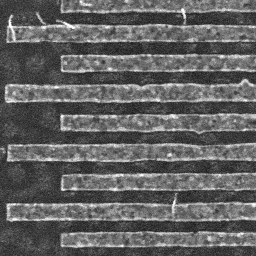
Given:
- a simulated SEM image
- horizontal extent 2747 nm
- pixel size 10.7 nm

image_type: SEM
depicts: parallel lines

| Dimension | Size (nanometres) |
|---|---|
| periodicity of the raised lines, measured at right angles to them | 316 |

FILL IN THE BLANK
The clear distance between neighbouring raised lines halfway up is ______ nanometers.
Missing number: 148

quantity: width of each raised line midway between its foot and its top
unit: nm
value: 168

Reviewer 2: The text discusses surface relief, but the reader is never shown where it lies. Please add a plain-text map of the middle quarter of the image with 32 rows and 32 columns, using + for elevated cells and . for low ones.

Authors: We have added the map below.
++++++++++++++++++++++++++++++++
++++++++++++++++++++++++++++++.+
................................
................................
................................
.++++..++++++++++++.++++++++++++
++++++++++++++++++++++++++++++++
++++++++++++++++++++++++++++++++
++++++++++++++++++++++++++++++++
................................
................................
................................
................................
++++++++++++++++++++++++++++++++
++++++++++++++++++++++++++++++++
++++++++++++++++++++++++++++++++
+++++++++.+++....++++++.........
................................
................................
................................
++++++++++++++++++++++++++++++++
++++++++++++++++++++++++++++++++
++++++++++++++++++++++++++++++++
++++++++++++++++++++++++++++++++
................................
................................
................................
.......................++++.++++
++++++++++++++++++++++++++++++++
++++++++++++++++++++++++++++++++
++++++++++++++++++++++++++++++++
................................